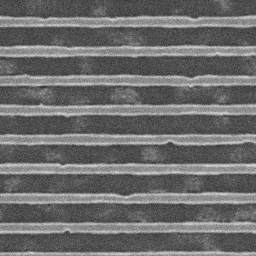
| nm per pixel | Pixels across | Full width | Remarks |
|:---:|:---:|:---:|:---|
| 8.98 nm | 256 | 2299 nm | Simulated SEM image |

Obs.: parallel lines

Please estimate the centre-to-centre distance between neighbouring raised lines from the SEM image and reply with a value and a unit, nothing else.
0.264 microns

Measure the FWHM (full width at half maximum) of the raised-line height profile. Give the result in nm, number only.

77.5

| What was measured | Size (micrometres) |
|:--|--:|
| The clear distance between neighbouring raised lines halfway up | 0.186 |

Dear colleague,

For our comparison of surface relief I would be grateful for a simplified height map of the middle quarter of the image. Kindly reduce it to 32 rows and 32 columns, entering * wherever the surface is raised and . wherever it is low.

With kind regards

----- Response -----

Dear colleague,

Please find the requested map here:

................................
................................
................................
*******************************.
********************************
...............................*
................................
................................
................................
................................
............********....*****.**
********************************
******************..............
................................
................................
................................
................................
................................
********************************
**************************.*****
................................
................................
................................
................................
................................
****.***************************
********************************
................................
................................
................................
................................
................................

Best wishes